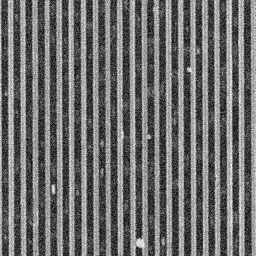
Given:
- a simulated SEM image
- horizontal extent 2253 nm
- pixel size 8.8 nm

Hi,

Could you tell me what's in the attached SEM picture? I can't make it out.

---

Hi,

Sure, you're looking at parallel lines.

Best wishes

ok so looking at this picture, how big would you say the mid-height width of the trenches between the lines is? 0.0693 microns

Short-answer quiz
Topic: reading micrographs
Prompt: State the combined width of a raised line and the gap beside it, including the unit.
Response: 107 nm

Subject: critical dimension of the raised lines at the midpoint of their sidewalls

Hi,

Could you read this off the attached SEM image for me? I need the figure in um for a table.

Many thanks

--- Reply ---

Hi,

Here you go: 0.0341